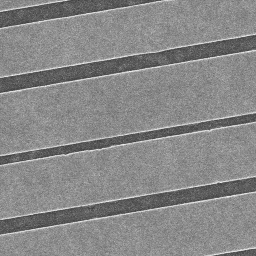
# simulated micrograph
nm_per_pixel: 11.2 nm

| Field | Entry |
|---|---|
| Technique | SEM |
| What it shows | one or a few lines or trenches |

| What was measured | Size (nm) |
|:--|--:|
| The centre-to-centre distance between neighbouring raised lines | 768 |